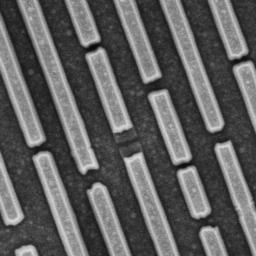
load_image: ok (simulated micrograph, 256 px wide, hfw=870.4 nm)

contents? parallel lines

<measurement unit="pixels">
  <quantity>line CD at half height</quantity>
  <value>16.9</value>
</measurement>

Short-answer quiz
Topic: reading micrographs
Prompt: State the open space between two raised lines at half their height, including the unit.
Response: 95 nm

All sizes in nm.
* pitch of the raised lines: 150